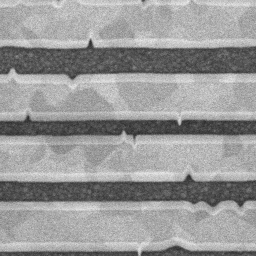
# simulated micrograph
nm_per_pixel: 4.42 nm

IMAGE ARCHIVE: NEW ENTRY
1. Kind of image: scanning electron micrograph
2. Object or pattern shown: one or a few lines or trenches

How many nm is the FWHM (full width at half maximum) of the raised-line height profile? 167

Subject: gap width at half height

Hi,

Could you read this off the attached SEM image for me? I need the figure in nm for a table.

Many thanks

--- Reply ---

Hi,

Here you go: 128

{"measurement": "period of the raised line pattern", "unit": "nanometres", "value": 297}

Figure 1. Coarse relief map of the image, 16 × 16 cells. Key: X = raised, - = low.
XXXXXXXXXXXXXXXX
XXXXXXXXXXXXXXXX
XXXXXXXXXXXXXXXX
----------------
----------------
XXXXXXXXXXXXXXXX
XXXXXXXXXXXXXXXX
----------------
----------------
XXXXXXXXXXXXXXXX
XXXXXXXXXXXXXXXX
----------------
----------------
XXXXXXXXXXXXXXXX
XXXXXXXXXXXXXXXX
----------------